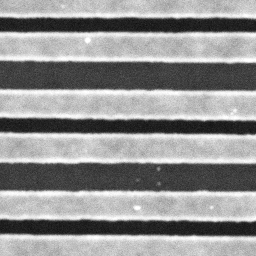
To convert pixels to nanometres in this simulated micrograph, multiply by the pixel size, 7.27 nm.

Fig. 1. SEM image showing lines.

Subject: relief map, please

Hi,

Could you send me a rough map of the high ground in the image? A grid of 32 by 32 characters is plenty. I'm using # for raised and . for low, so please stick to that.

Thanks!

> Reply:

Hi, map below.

################################
################################
................................
................................
################################
################################
################################
.....##..#######################
................................
................................
................................
################################
################################
################################
################################
................................
................................
################################
################################
################################
................................
................................
................................
................................
################################
################################
################################
.............##.....############
................................
#####################...........
################################
################################